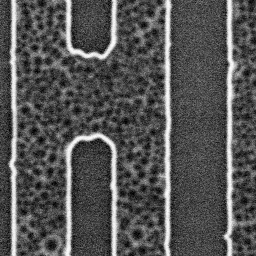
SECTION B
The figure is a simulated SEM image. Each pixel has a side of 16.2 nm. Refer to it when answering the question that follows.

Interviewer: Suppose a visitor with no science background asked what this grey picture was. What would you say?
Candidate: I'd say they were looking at one or a few lines or trenches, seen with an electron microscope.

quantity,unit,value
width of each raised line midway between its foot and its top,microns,0.891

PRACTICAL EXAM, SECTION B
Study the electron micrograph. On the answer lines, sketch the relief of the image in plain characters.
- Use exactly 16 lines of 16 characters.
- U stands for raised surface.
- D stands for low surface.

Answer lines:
DUUUDDDUUUUDDDUU
DUUUDDDUUUDDDDUU
DUUUDDDUUUUDDDUU
DUUUUUUUUUDDDDUU
DUUUUUUUUUDDDDUU
DUUUUUUUUUDDDDUU
DUUUUUUUUUDDDDUU
DUUUUUUUUUUDDDUU
DUUUUUUUUUDDDDUU
DUUUDDDUUUDDDDUU
DUUUDDDUUUDDDDUU
DUUUDDDUUUUDDDUU
DUUUDDDUUUDDDDUU
DUUUDDDUUUDDDDUU
DUUUDDDUUUDDDDUU
DUUUDDDUUUDDDDUU